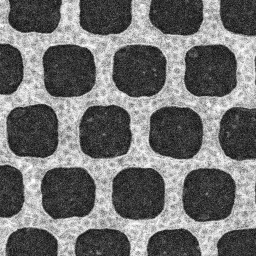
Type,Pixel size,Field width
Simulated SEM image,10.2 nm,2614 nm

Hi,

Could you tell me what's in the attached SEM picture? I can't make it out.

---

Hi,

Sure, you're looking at a regular array of holes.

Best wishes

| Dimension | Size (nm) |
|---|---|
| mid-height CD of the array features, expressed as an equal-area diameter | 575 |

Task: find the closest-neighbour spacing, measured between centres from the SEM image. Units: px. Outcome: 70.3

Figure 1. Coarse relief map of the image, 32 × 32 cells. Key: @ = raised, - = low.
@-------@@------@@@------@@-----
@-------@@------@@@-------@-----
@-------@@-------@@------@@@----
@@-----@@@------@@@@-----@@@----
@@@@@@@@@@@@@@@@@@@@@@@@@@@@@@@-
-@@@@@@@@@@@@@@@@@@@@@@@@@-@@@@@
---@@@-----@@@------@@@------@@@
---@@-------@@-------@@-------@@
---@@-------@@-------@@-------@@
---@@-------@@-------@@-------@@
---@@-------@@-------@@-------@@
--@@@@-----@@@@-----@@@@-----@@@
@@@@@@@@@@@@@@@@@@@@@@@@@@@@@@@@
@@----@@@@@----@@@@@----@@@@@--@
@------@@@------@@@------@@@----
@------@@@------@@@------@@@----
@------@@@-------@@------@@-----
@------@@@-------@@------@@-----
@------@@@------@@@------@@@----
@@----@@@@@----@@@@@@---@@@@----
@@@@@@@@@@@@@@@@@@@@@@@@@@@@@@@@
---@@@-----@@@@-----@@@@----@@@@
---@@-------@@-------@@------@@@
---@@-------@@-------@@-------@@
---@@-------@@-------@@------@@@
---@@-------@@-------@@------@@@
--@@@@-----@@@------@@@------@@@
@@@@@@@@@@@@@@@@--@@@@@@----@@@@
@@@--@@@@@@@@@@@@@@@@@@@@@@@@@@@
@------@@@------@@@-----@@@@----
@------@@-------@@-------@@-----
@------@@-------@@-------@@-----